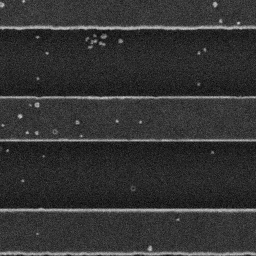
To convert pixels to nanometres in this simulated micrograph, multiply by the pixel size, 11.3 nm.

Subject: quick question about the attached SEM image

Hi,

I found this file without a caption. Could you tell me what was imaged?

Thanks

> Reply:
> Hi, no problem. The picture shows lines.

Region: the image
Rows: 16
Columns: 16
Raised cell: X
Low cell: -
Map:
XXXXXXXXXXXXXXXX
XXXXXXXXXXXXXXXX
----------------
----------------
----------------
----------------
XXXXXXXXXXXXXXXX
XXXXXXXXXXXXXXXX
XXXXXXXXXXXXXXXX
----------------
----------------
----------------
----------------
XXXXXXXXXXXXXXXX
XXXXXXXXXXXXXXXX
XXXXXXXXXXXXXXXX